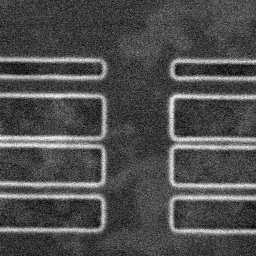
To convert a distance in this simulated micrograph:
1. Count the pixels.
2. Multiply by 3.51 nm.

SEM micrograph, groups of lines, slits or small figures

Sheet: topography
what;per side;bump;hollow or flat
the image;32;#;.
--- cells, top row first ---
################################
################################
################################
################################
################################
################################
################################
.###############################
.............#########..........
#...........##########..........
################################
################################
.............#########..........
.............########...........
.............########...........
.............########...........
.............#########..........
################################
............##########....######
.............########...........
.............########...........
.............########...........
.............#########..........
################################
################################
.............#########..........
.............########...........
.............########...........
............##########..........
################################
################################
################################